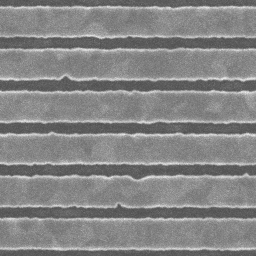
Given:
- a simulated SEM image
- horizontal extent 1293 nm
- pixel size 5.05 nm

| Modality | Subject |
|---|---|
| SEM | parallel lines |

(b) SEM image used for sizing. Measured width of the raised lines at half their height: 151 nm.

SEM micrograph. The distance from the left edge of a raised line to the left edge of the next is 214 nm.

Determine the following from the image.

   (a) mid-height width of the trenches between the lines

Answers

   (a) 59.9 nm